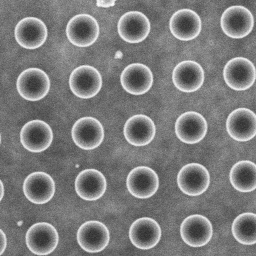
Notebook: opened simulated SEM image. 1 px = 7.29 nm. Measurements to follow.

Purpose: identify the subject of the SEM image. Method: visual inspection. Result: an array of small figures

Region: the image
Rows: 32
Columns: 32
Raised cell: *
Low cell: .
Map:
................................
......................**....***.
...**....***...***...****...****
..****..****...****..****...***.
..****..****...***....**.....**.
..***....**.....................
................................
.............................**.
..........**....**....***...****
..****...****..****...***...****
..****...****..****...***...****
..****...***....**..............
....*...........................
................................
.................*.....**....***
...***...****...***...****..****
...***...****...***...****...***
...***...****...***....**.....*.
...***....**....................
................................
........................*....***
..........**....***...****...***
...****..****...****..****...***
...****..****...****...***...***
...****...***....**.............
................................
................................
.................**....***...***
....***...***...****...***...***
*..****...****..****...***...***
*..****...***....***....**.....*
....**..........................